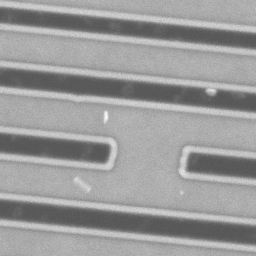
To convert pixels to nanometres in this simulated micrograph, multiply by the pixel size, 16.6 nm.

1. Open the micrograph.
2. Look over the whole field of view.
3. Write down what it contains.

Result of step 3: one or a few lines or trenches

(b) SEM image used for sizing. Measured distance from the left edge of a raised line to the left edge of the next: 1070 nm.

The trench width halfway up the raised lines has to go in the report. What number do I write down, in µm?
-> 0.616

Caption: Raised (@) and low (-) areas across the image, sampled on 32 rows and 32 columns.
@@------------------------------
@@@@@@@@@@@@--------------------
@@@@@@@@@@@@@@@@@@@@@-----------
-@@@@@@@@@@@@@@@@@@@@@@@@@@@@@@-
-----------@@@@@@@@@@@@@@@@@@@@@
--------------------@@@@@@@@@@@@
------------------------------@@
--------------------------------
@@@@@@--------------------------
@@@@@@@@@@@@@@@@----------------
@@@@@@@@@@@@@@@@@@@@@@@@@@------
--@@@@@@@@@@@@@@@@@@@@@@@@@@@@@@
-----------@@@@@@@@@@@@@@@@@@@@@
---------------------@@@@@@@@@@@
-------------------------------@
--------------------------------
@@@@@---------------------------
@@@@@@@@@@@@@@------------------
@@@@@@@@@@@@@@------------------
@@@@@@@@@@@@@@---------@@@@@@@@@
---------@@@@@---------@@@@@@@@@
-----------------------@@@@@@@@@
----------------------------@@@@
--------------------------------
@-------------------------------
@@@@@@@@@@----------------------
@@@@@@@@@@@@@@@@@@@@------------
@@@@@@@@@@@@@@@@@@@@@@@@@@@@@@--
------@@@@@@@@@@@@@@@@@@@@@@@@@@
----------------@@@@@@@@@@@@@@@@
-------------------------@@@@@@@
--------------------------------